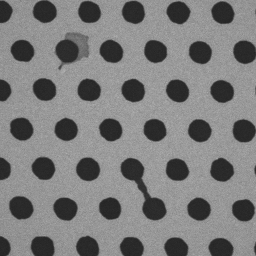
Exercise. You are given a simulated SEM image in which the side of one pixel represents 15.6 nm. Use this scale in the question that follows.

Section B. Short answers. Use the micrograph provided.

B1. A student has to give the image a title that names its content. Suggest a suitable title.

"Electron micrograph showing a regular array of holes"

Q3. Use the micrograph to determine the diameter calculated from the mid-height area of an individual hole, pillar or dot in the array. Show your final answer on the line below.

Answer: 357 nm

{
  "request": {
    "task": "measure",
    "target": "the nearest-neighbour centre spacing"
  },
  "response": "689 nm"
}